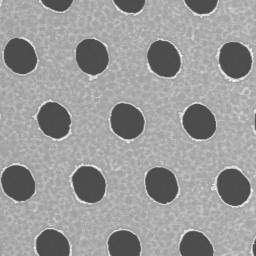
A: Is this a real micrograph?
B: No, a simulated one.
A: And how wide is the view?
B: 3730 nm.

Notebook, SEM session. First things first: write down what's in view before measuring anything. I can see a regular array of holes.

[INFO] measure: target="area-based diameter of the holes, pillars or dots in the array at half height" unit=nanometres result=505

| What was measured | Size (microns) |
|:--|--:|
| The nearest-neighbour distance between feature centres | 1.05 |